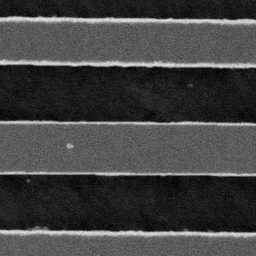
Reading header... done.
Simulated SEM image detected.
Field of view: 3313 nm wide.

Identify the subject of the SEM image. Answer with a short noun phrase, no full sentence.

lines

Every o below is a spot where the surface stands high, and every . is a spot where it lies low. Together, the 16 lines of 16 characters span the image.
................
oooooooooooooooo
oooooooooooooooo
oooooooooooooooo
................
................
................
................
oooooooooooooooo
oooooooooooooooo
oooooooooooooooo
................
................
................
ooooooo.o.......
oooooooooooooooo